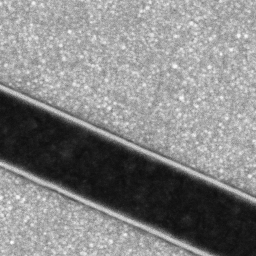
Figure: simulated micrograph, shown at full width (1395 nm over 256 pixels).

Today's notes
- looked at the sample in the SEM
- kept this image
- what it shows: one or a few lines or trenches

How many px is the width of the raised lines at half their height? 72.2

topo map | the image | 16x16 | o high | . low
................
................
................
................
................
................
ooo.............
ooooo...........
ooooooo.........
ooooooooo.......
.ooooooooooo....
...ooooooooooo..
.....ooooooooooo
.......ooooooooo
..........oooooo
............oooo